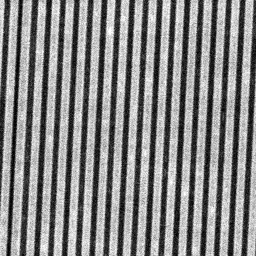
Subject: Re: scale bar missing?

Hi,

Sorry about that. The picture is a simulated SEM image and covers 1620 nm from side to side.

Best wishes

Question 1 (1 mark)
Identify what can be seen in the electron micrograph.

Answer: parallel lines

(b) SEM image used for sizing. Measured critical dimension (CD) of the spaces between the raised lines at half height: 42.7 nm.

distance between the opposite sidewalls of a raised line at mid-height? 42.7 nanometers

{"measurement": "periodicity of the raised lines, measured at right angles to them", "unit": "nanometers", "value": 87.4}